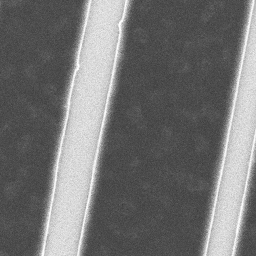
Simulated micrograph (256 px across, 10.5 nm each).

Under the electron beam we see one or a few lines or trenches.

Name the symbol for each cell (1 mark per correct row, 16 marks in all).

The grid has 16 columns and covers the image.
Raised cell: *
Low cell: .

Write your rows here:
******..********
*****...********
*****..********.
*****..********.
*****..********.
*****..********.
****...********.
****..*********.
****..********..
****..********..
****..********..
***...********.*
***...********.*
***..********..*
***..********..*
***..********..*